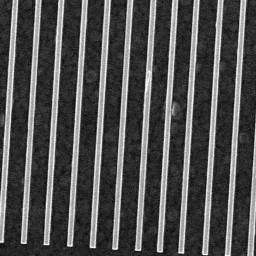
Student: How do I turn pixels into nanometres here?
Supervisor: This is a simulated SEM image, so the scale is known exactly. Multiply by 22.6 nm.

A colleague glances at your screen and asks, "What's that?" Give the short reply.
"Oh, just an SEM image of parallel lines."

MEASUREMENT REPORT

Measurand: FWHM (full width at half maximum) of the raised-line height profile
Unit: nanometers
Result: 104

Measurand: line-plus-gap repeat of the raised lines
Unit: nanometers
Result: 515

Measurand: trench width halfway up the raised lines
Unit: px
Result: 18.1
